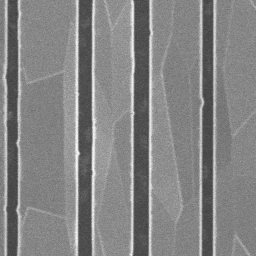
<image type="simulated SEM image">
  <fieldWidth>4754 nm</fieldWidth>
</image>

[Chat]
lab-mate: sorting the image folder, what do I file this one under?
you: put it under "one or a few lines or trenches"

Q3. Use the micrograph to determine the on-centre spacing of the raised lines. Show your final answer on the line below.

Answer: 1190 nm